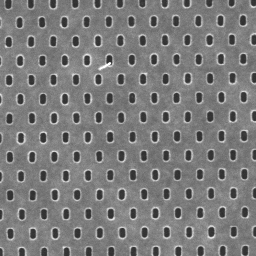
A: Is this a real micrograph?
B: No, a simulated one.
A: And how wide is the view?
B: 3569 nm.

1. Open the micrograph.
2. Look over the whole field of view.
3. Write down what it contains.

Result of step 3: a regular array of holes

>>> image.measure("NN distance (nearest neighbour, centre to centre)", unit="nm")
306